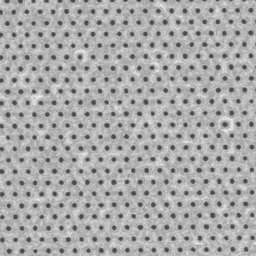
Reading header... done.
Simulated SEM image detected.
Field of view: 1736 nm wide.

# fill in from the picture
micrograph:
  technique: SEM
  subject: a regular array of holes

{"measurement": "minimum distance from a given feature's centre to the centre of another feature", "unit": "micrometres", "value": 0.087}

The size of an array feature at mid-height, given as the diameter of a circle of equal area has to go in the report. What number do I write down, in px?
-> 4.78